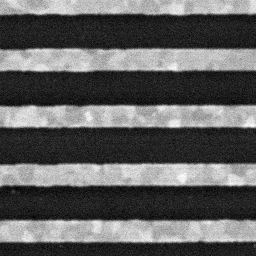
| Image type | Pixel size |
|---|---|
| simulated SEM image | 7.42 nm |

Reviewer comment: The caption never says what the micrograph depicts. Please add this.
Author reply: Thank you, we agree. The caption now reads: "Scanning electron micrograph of lines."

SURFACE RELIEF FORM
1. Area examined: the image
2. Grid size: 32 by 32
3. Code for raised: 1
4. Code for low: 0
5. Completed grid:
11111111111111111111111111111111
11111111111111111111111111111111
00000000000000000000000000000000
00000000000000000000000000000000
00000000000000000000000000000000
00000000000000000000000000000000
11111111111111111111111111111111
11111111111111111111111111111111
11111111111111111111111111111111
00000000000000000000000000000000
00000000000000000000000000000000
00000000000000000000000000000000
00000000000000000000000000000000
11111111111111111111111111111111
11111111111111111111111111111111
11111111111111111111111111111111
00000000000000000000000000000000
00000000000000000000000000000000
00000000000000000000000000000000
00000000000000000000000000000000
00000000000000000000000000000000
11111111111111111111111111111111
11111111111111111111111111111111
00000000000000000000000000000000
00000000000000000000000000000000
00000000000000000000000000000000
00000000000000000000000000000000
00000000000000000000000000000000
11111111111111111111111111111111
11111111111111111111111111111111
00000000000000000000000000000000
00000000000000000000000000000000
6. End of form